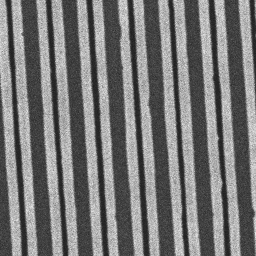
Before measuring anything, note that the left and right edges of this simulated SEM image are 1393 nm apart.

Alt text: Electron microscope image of parallel lines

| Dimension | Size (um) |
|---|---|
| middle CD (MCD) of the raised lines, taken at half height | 0.0549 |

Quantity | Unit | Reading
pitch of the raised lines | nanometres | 110